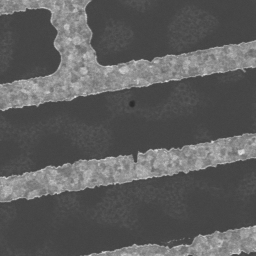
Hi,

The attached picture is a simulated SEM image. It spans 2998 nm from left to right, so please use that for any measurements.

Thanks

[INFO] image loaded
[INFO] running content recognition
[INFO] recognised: one or a few lines or trenches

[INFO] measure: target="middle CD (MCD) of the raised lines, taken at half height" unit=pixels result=24.8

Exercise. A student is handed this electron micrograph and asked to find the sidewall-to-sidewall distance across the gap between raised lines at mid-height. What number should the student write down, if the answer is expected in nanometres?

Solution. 771